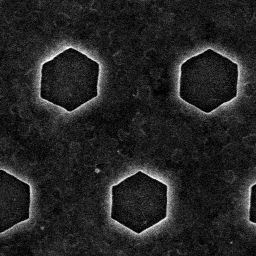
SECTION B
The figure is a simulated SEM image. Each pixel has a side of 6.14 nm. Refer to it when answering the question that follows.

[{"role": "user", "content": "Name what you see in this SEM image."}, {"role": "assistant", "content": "holes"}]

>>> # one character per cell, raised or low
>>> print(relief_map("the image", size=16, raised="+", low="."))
++++++++++++++++
++++++++++++++++
++++++++++++++++
+++..+++++++..++
+++...+++++....+
+++...+++++....+
+++..+++++++..++
++++++++++++++++
++++++++++++++++
++++++++++++++++
++++++++++++++++
..+++++...++++++
..+++++...++++++
..+++++...++++++
++++++++++++++++
++++++++++++++++